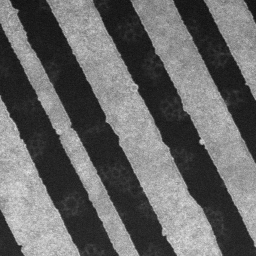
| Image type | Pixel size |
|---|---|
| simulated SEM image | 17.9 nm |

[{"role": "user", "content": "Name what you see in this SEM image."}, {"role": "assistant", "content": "one or a few lines or trenches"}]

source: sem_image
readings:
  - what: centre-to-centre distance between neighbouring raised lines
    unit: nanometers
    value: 1200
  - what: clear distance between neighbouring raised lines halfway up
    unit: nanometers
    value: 616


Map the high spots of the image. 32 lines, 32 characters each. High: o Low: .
o.....oooooo.....ooooo....ooooo.
oo.....ooooo.....ooooo....ooooo.
oo.....oooooo.....ooooo....ooooo
ooo.....ooooo.....ooooo....ooooo
.oo.....oooooo.....ooooo....oooo
.ooo.....ooooo.....ooooo....oooo
..oo.....oooooo.....ooooo....ooo
..ooo.....ooooo.....ooooo....ooo
...oo.....oooooo.....ooooo....oo
...ooo.....ooooo.....ooooo....oo
....oo.....oooooo.....ooooo....o
....ooo.....ooooo.....ooooo....o
.....oo.....oooooo.....ooooo....
o....ooo.....ooooo.....ooooo....
o.....oo.....oooooo.....ooooo...
oo....ooo.....ooooo.....ooooo...
oo.....oo.....oooooo.....ooooo..
ooo.....oo.....ooooo.....ooooo..
ooo.....oo.....oooooo.....ooooo.
oooo.....oo.....ooooo.....ooooo.
oooo.....ooo....oooooo.....ooooo
ooooo.....oo.....ooooo.....ooooo
ooooo.....ooo....oooooo.....oooo
oooooo.....oo.....ooooo.....oooo
oooooo.....ooo....oooooo.....ooo
ooooooo.....oo.....oooooo....ooo
ooooooo.....ooo....oooooo.....oo
.ooooooo.....oo.....oooooo....oo
.ooooooo.....ooo....oooooo.....o
..ooooooo.....oo.....oooooo....o
..ooooooo.....ooo....oooooo.....
...ooooooo.....oo.....oooooo....